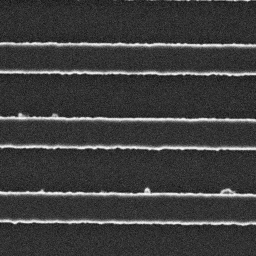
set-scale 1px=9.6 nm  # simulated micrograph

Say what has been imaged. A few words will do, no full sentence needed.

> lines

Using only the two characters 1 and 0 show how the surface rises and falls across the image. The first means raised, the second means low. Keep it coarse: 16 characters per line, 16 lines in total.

0000000000000000
0000000000000000
0000000000000000
1111111111111111
1111111111111111
0000000000000000
0000000000000000
1111111111111111
1111111111111111
0000000000000000
0000000000000000
0000000000000000
1111111111111111
1111111111111111
0000000000000000
0000000000000000